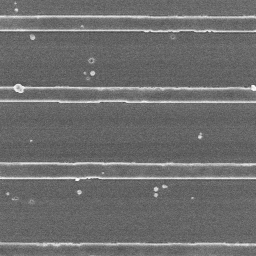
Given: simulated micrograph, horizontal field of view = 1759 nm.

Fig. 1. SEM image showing lines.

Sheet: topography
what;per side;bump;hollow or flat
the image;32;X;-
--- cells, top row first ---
--------------------------------
--------------------------------
XXXXXXXXXXXXXXXXXXXXXXXXXXXXXXXX
XXXXXXXXXXXXXXXXXXXXXXXXXXXXXXXX
--------------------------------
--------------------------------
--------------------------------
--------------------------------
--------------------------------
--------------------------------
--------------------------------
XXXXXXXXXXXXXXXXXXXXXXXXXXXXXXXX
XXXXXXXXXXXXXXXXXXXXXXXXXXXXXXXX
--------------------------------
--------------------------------
--------------------------------
--------------------------------
--------------------------------
--------------------------------
--------------------------------
XXXXXXXXXXXXXXXXXXXXXXX-XXXXXXXX
XXXXXXXXXXXXXXXXXXXXXXXXXXXXXXXX
--------------------------------
--------------------------------
--------------------------------
--------------------------------
--------------------------------
--------------------------------
--------------------------------
--------------------------------
XXX-----------------------------
XXXXXXXXXXXXXXXXXXXXXXXXXXXXXXXX